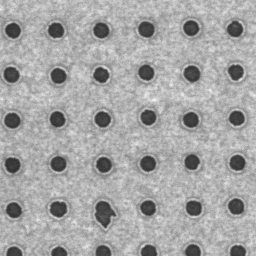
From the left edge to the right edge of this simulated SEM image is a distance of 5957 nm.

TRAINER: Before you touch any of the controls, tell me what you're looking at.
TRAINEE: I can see a regular array of holes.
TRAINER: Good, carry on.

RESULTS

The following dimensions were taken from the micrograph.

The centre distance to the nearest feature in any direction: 1010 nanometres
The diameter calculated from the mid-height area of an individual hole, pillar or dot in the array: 392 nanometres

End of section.